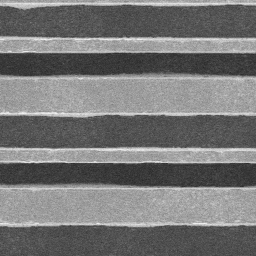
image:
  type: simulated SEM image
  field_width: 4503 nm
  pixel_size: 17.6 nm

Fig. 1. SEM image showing lines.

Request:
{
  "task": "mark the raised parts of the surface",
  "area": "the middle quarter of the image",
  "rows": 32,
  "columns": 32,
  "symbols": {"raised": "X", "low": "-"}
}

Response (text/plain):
--------------------------------
--------------------------------
--------------------------------
--------------------------------
XXXXXXXXXXXXXXXXXXXXXXXXXXXXXXXX
XXXXXXXXXXXXXXXXXXXXXXXXXXXXXXXX
XXXXXXXXXXXXXXXXXXXXXXXXXXXXXXXX
XXXXXXXXXXXXXXXXXXXXXXXXXXXXXXXX
XXXXXXXXXXXXXXXXXXXXXXXXXXXXXXXX
XXXXXXXXXXXXXXXXXXXXXXXXXXXXXXXX
XXXXXXXXXXXXXXXXXXXXXXXXXXXXXXXX
XXXXXXXXXXXXXXXXXXXXXXXXXXXXXXXX
--XXXXXX------------------------
--------------------------------
--------------------------------
--------------------------------
--------------------------------
--------------------------------
--------------------------------
--------------------------------
--------------------------------
XXXXXXXXXXXXXXXXXXXXXXXXXXX-X--X
XXXXXXXXXXXXXXXXXXXXXXXXXXXXXXXX
XXXXXXXXXXXXXXXXXXXXXXXXXXXXXXXX
XXXXXXXXXXXXXXXXXXXXX-XXXXXXXXXX
--------------------------------
--------------------------------
--------------------------------
--------------------------------
--------------------------------
--------------------------------
XXXXXXXXXXXXXXXXXXXXXXXXXXXXXXXX